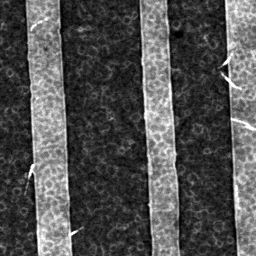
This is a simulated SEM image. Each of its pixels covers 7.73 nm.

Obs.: one or a few lines or trenches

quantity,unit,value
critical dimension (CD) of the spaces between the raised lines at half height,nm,540